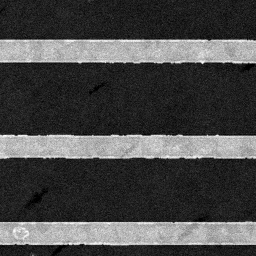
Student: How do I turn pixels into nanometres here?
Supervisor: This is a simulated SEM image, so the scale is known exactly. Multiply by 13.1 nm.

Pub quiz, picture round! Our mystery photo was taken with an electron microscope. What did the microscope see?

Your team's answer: lines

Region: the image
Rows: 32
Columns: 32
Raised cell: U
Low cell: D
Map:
DDDDDDDDDDDDDDDDDDDDDDDDDDDDDDDD
DDDDDDDDDDDDDDDDDDDDDDDDDDDDDDDD
DDDDDDDDDDDDDDDDDDDDDDDDDDDDDDDD
DDDDDDDDDDDDDDDDDDDDDDDDDDDDDDDD
DDDDDDDDDDDDDDDDDDDDDDDDDDDDDDDD
UUUUUUUUUUUUUUUUUUUUUUUUUUUUUUUU
UUUUUUUUUUUUUUUUUUUUUUUUUUUUUUUU
UUUUUUUUUUUUUUUUUUUUUUUUUUUUUUUU
DDDDDDDDDDDDDDDDDDDDDDDDDDDDDDDD
DDDDDDDDDDDDDDDDDDDDDDDDDDDDDDDD
DDDDDDDDDDDDDDDDDDDDDDDDDDDDDDDD
DDDDDDDDDDDDDDDDDDDDDDDDDDDDDDDD
DDDDDDDDDDDDDDDDDDDDDDDDDDDDDDDD
DDDDDDDDDDDDDDDDDDDDDDDDDDDDDDDD
DDDDDDDDDDDDDDDDDDDDDDDDDDDDDDDD
DDDDDDDDDDDDDDDDDDDDDDDDDDDDDDDD
DDDDDDDDDDDDDDDDDDDDDDDDDDDDDDDD
UUUUUUUUUUUUUUUUUUUUUUUUUUUUUUUU
UUUUUUUUUUUUUUUUUUUUUUUUUUUUUUUU
UUUUUUUUUUUUUUUUUUUUUUUUUUUUUUUU
DDDDDDDDDDDDDDDDDDDDDDDDDDDDDDDD
DDDDDDDDDDDDDDDDDDDDDDDDDDDDDDDD
DDDDDDDDDDDDDDDDDDDDDDDDDDDDDDDD
DDDDDDDDDDDDDDDDDDDDDDDDDDDDDDDD
DDDDDDDDDDDDDDDDDDDDDDDDDDDDDDDD
DDDDDDDDDDDDDDDDDDDDDDDDDDDDDDDD
DDDDDDDDDDDDDDDDDDDDDDDDDDDDDDDD
DDDDDDDDDDDDDDDDDDDDDDDDDDDDDDDD
UUUUUUUUUUUUUUUUUUUUUUUUUUUUUUUU
UUUUUUUUUUUUUUUUUUUUUUUUUUUUUUUU
UUDDUUUUDDDUDDDDDDUUUUUUUUUUUUUU
DDDDDDDDDDDDDDDDDDDDDDDDDDDDDDDD